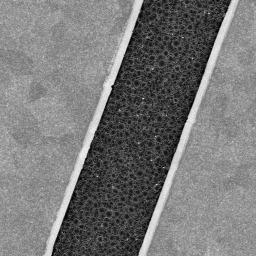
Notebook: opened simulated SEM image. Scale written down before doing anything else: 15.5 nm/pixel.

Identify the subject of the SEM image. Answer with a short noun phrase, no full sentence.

one or a few lines or trenches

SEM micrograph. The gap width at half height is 1360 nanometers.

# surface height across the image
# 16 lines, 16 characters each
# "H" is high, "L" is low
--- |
HHHHHHHHHLLLLLHH
HHHHHHHHLLLLLLHH
HHHHHHHHLLLLLLHH
HHHHHHHHLLLLLHHH
HHHHHHHLLLLLLHHH
HHHHHHHLLLLLLHHH
HHHHHHLLLLLLHHHH
HHHHHHLLLLLLHHHH
HHHHHHLLLLLHHHHH
HHHHHLLLLLLHHHHH
HHHHHLLLLLLHHHHH
HHHHHLLLLLHHHHHH
HHHHLLLLLLHHHHHH
HHHHLLLLLLHHHHHH
HHHLLLLLLHHHHHHH
HHHLLLLLLHHHHHHH